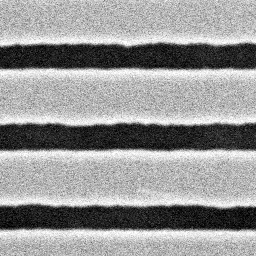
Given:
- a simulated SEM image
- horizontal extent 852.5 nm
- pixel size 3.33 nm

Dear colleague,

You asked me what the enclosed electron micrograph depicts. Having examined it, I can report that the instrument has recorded lines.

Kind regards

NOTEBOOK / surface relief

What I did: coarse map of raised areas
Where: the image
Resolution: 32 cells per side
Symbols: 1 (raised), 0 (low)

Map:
11111111111111111111111111111111
11111111111111111111111111111111
11111111111111111111111111111111
11111111111111111111111111111111
11111111111111111111111111111111
11110000000000011100000000111000
00000000000000000000000000000000
00000000000000000000000000000000
00000000000000000000000000000000
11111111111111111111111111111111
11111111111111111111111111111111
11111111111111111111111111111111
11111111111111111111111111111111
11111111111111111111111111111111
11111111111111111111111111111111
00000000111100000000101100000000
00000000000000000000000000000000
00000000000000000000000000000000
00000000000000000000000000000000
11111111111111111111111111111111
11111111111111111111111111111111
11111111111111111111111111111111
11111111111111111111111111111111
11111111111111111111111111111111
11111111111111111111111111111111
11110111111111111111111111111111
00000000000000000000000000000000
00000000000000000000000000000000
00000000000000000000000000000000
11111111111111111111111111111111
11111111111111111111111111111111
11111111111111111111111111111111